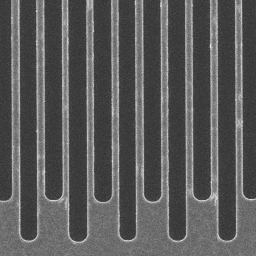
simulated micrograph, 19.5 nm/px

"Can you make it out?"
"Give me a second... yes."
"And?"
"parallel lines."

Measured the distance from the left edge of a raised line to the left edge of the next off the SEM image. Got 483 nanometres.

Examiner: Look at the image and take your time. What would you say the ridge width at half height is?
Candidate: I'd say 136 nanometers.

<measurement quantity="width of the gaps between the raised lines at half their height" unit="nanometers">351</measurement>